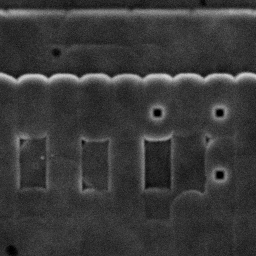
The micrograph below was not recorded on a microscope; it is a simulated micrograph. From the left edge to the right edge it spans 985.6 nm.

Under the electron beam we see wiring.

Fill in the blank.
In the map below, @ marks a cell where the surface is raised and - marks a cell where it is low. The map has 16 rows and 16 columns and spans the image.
----------------
----------------
----------------
----------------
----------------
@@@@@@@@@@@@@@@@
@@@@@@@@@@@@@@@@
@@@@@@@@@@@@@@@@
@@@@@@@@@@@@@@@@
@@@@@@@@@@@@@@@@
@@@@@@@@@@@@@@@@
@@@@@@@@@@@@@@@@
@@@@@@@@@@@@@@@@
@@@@@@@@@@@@@@@@
@@@@@@@@@@@@@@@@
@@@@@@@@@@@@@@@@